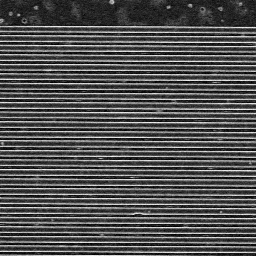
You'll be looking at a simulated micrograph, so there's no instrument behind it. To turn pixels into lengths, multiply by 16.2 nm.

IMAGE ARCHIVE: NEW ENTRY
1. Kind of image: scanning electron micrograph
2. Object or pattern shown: parallel lines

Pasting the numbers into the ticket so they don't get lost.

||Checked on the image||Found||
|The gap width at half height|52.6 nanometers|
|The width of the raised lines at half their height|0.0991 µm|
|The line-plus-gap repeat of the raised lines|0.155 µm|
